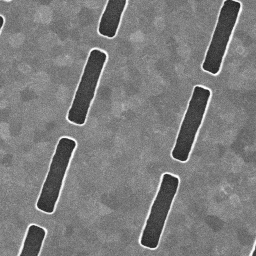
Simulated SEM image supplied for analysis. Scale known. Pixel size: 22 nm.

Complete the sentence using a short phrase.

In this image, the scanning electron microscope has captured holes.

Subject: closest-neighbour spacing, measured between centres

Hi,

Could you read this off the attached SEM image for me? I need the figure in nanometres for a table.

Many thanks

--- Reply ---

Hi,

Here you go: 2060